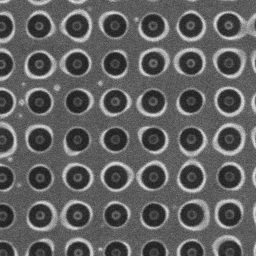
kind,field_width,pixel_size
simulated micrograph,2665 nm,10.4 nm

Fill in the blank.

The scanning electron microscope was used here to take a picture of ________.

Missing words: an array of small figures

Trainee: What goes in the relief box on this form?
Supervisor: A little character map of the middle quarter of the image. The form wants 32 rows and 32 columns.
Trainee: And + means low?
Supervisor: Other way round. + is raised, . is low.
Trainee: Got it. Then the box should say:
...+..++++..+...+++.......++...+
......++++.....++++......++++...
++...++++++....+++++....+++++++.
++++++++++++++++++++++++++++++++
++++++++++++++++++++++++++++++++
++++++++++++++++++++++++++++++++
+++.++++++++.+++++++++.+++++++..
+.....++++.....+++++.....++++...
.......+++......+++......++++..+
..++...++...+...+++...+..++++..+
+.....++++......+++......++++...
+.....++++.....++++......++++...
+++.++++++++.++++++++...+++++++.
++++++++++++++++++++++++++++++++
++++++++++++++++++++++++++++++++
++++++++++++++++++++++++++++++++
++...++++++....+++++....++++++..
+.....++++......+++......++++...
...+..++++..++..+++..++...+++..+
...+..++++..++..+++..++...+++..+
......++++......++++.....++++...
+....++++++...+++++++...++++++..
++++++++++++++++++++++++++++++++
++++++++++++++++++++++++++++++++
++++++++++++++++++++++++++++++++
++..+++++++....+++++.....+++++..
+.....++++......++++.....++++...
.......+++.......++...+...+++...
...+...+++..++...++..++...+++..+
.......+++......+++......++++...
+.....+++++....+++++.....++++...
+++.++++++++.++++++++++++++++++.